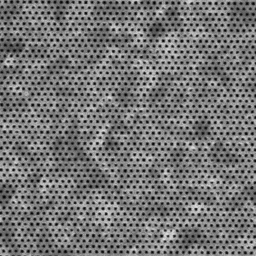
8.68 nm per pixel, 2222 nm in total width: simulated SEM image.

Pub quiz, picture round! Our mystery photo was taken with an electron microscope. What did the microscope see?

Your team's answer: a regular array of holes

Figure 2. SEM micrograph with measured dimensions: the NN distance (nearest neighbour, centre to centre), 51 nm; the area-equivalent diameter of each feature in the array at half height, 29.4 nanometers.